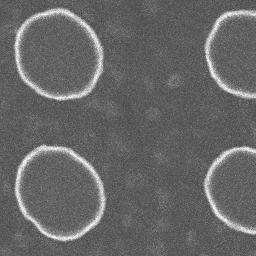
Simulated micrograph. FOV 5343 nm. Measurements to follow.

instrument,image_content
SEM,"raised bodies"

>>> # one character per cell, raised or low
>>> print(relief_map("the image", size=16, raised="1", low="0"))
0000000000000000
0011100000000011
0111110000000111
0111110000000111
0111110000000111
0011110000000011
0000000000000000
0000000000000000
0000000000000000
0011000000000011
0111110000000111
0111110000000111
0111110000000111
0011110000000011
0001100000000000
0000000000000000